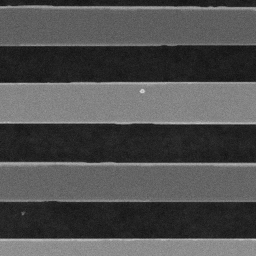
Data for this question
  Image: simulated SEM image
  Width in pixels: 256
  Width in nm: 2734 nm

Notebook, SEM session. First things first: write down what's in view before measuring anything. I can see lines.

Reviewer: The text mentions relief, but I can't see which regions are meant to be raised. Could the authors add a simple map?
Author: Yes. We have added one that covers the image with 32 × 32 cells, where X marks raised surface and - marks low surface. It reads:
--------------------------------
XXXXXXXXXXXXXXXXXXXXXXXXXXXXXXXX
XXXXXXXXXXXXXXXXXXXXXXXXXXXXXXXX
XXXXXXXXXXXXXXXXXXXXXXXXXXXXXXXX
XXXXXXXXXXXXXXXXXXXXXXXXXXXXXXXX
XXXXXXXXXXXXXXXXXXXXXXXXXXXXXXXX
--------------------------------
--------------------------------
--------------------------------
--------------------------------
XXXXXXXXXXXXXXXXXXXXXXXXXXXXXXXX
XXXXXXXXXXXXXXXXXXXXXXXXXXXXXXXX
XXXXXXXXXXXXXXXXXXXXXXXXXXXXXXXX
XXXXXXXXXXXXXXXXXXXXXXXXXXXXXXXX
XXXXXXXXXXXXXXXXXXXXXXXXXXXXXXXX
--------------------------------
--------------------------------
--------------------------------
--------------------------------
--------------------------------
XXXXXXXXXXXXXXXXXXXXXXXXXXXXXXXX
XXXXXXXXXXXXXXXXXXXXXXXXXXXXXXXX
XXXXXXXXXXXXXXXXXXXXXXXXXXXXXXXX
XXXXXXXXXXXXXXXXXXXXXXXXXXXXXXXX
XXXXXXXXXXXXXXXXXXXXXXXXXXXXXXXX
--------------------------------
--------------------------------
--------------------------------
--------------------------------
--------------------------------
XXXXXXXXXXXXXXXXXXXXXXXXXXXXXXXX
XXXXXXXXXXXXXXXXXXXXXXXXXXXXXXXX